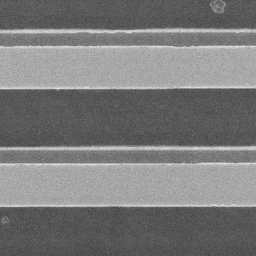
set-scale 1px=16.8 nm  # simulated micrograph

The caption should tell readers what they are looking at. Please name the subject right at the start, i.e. lines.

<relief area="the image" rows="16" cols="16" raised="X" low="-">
----------------
----------------
XXXXXXXXXXXXXXXX
XXXXXXXXXXXXXXXX
XXXXXXXXXXXXXXXX
XXXXX---XX------
----------------
----------------
----------------
XXXXXXXXXXXXXXXX
XXXXXXXXXXXXXXXX
XXXXXXXXXXXXXXXX
XXXXXXXXXXXXXXXX
----------------
----------------
----------------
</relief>